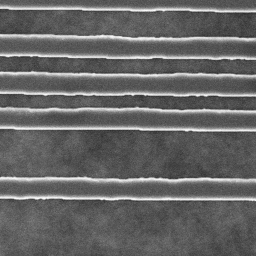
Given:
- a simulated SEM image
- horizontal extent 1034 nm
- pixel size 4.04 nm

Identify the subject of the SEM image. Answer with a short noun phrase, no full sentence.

lines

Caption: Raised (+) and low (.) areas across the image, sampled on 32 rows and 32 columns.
++++++++++++++++++++++++++++++++
................................
................................
................................
+++++++.....++..................
++++++++++++++++++++++++++++++++
++++++++++++++++++++++++++++++++
................................
................................
+++++++++++++++++++++++++++++++.
++++++++++++++++++++++++++++++++
++++++++++++++++++++++++++++++++
................................
................................
++++++++++++++++++++++++++++++++
++++++++++++++++++++++++++++++++
................................
................................
................................
................................
................................
................................
++++++++++++++++++++++++++++++++
++++++++++++++++++++++++++++++++
++++++++++++++++++++++++++++++++
................................
................................
................................
................................
................................
................................
................................